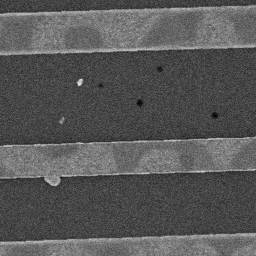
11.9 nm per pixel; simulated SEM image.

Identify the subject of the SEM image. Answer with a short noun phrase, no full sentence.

lines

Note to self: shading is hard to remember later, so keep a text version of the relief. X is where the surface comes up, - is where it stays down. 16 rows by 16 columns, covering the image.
---------------X
XXXXXXXXXXXXXXXX
XXXXXXXXXXXXXXXX
----------------
----------------
----------------
----------------
----------------
----------------
XXXXXXXXXXXXXXXX
XXXXXXXXXXXXXXXX
----------------
----------------
----------------
----------------
XXXXXXXXXXXXXXXX